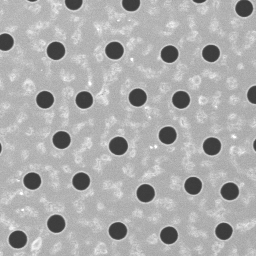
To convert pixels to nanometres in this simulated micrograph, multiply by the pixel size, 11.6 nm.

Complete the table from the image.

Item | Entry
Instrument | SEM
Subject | a regular array of holes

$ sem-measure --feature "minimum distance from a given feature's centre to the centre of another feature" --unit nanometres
492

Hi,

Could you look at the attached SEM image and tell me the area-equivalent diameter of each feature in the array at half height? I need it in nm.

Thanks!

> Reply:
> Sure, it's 206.